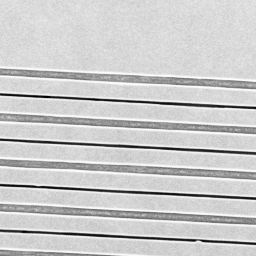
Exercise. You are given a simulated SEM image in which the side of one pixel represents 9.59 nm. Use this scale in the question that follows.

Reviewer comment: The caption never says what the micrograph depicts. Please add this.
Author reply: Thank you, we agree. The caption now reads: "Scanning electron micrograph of parallel lines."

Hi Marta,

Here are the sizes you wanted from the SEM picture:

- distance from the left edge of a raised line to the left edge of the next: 215 nanometres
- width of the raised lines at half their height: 166 nanometers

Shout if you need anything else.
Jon